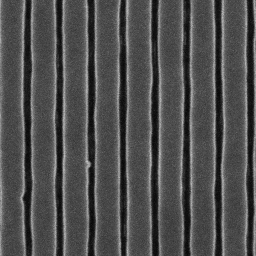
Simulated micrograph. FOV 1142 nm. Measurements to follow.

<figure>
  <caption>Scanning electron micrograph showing parallel lines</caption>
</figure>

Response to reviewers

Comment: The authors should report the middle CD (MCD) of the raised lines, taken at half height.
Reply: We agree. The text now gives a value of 0.106 um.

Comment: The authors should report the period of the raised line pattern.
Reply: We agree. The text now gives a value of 0.142 micrometres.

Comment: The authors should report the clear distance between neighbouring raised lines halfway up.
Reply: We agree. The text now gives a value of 0.0345 µm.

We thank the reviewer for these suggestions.